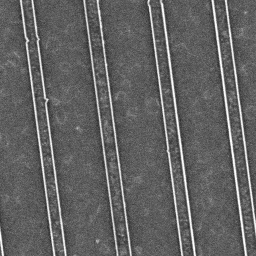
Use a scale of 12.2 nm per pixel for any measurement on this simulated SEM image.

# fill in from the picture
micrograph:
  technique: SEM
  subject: one or a few lines or trenches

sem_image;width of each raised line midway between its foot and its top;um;0.154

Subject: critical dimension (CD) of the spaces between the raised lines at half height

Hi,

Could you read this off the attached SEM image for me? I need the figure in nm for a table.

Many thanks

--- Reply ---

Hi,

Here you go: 613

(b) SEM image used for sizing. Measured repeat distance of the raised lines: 774 nm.